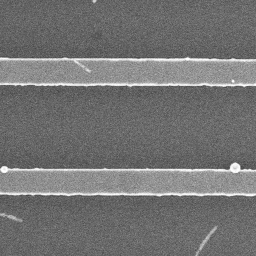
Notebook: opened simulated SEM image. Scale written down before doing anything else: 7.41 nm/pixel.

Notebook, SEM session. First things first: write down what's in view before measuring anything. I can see lines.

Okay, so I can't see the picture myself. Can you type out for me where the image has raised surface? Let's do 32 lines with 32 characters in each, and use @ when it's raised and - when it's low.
--------------------------------
--------------------------------
--------------------------------
--------------------------------
--------------------------------
--------------------------------
--------------------------------
@@@@@@@@@@@@@@@@@@@@@@@@@@@@-@--
@@@@@@@@@@@@@@@@@@@@@@@@@@@@@@@@
@@@@@@@@@@@@@@@@@@@@@@@@@@@@@@@@
@@@@@@@@@@@@@@@@@@@@@@@@@@@@@@@@
--------------------------------
--------------------------------
--------------------------------
--------------------------------
--------------------------------
--------------------------------
--------------------------------
--------------------------------
--------------------------------
--------------------------------
@@@@@@@@@@@@@@@@@@@@@@@@@@@@@@@@
@@@@@@@@@@@@@@@@@@@@@@@@@@@@@@@@
@@@@@@@@@@@@@@@@@@@@@@@@@@@@@@@@
--------------------------------
--------------------------------
--------------------------------
--------------------------------
--------------------------------
--------------------------------
--------------------------------
--------------------------------